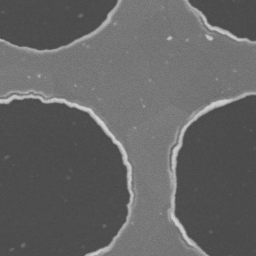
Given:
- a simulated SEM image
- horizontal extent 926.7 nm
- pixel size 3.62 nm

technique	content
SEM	holes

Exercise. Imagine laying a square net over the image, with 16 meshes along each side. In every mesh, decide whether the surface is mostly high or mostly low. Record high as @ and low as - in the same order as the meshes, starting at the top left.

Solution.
-------@@@@@----
------@@@@@@@---
-----@@@@@@@@@@@
@@@@@@@@@@@@@@@@
@@@@@@@@@@@@@@@@
@@@@@@@@@@@@@@@@
----@@@@@@@@@@--
------@@@@@@----
-------@@@@-----
--------@@@-----
--------@@@-----
--------@@@-----
--------@@@-----
--------@@@-----
-------@@@@@----
-------@@@@@----